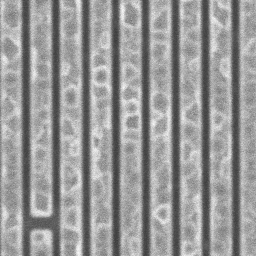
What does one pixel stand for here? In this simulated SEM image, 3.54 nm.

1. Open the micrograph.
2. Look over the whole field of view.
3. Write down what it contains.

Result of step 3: parallel lines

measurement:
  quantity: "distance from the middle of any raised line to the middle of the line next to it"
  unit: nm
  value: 106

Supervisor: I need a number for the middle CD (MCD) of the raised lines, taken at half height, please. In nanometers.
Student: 75.3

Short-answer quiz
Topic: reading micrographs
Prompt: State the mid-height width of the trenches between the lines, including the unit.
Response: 30.1 nm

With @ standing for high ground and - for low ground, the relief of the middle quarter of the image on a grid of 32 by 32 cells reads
@@@@---@@@@@--@@@@@---@@@@@--@@@
@@@@---@@@@@--@@@@@---@@@@@--@@@
@@@@---@@@@@--@@@@@---@@@@@--@@@
@@@@---@@@@@--@@@@@---@@@@@--@@@
@@@@---@@@@@--@@@@@---@@@@@--@@@
@@@@---@@@@@--@@@@@---@@@@@--@@@
@@@@---@@@@@--@@@@@---@@@@@--@@@
@@@@---@@@@@--@@@@@---@@@@@--@@@
@@@@---@@@@@--@@@@@---@@@@@--@@@
@@@@---@@@@@--@@@@@---@@@@@--@@@
@@@@---@@@@@--@@@@@---@@@@@--@@@
@@@@---@@@@@--@@@@@---@@@@@--@@@
@@@@---@@@@@--@@@@@---@@@@@--@@@
@@@@---@@@@@--@@@@@---@@@@@--@@@
@@@@---@@@@@--@@@@@---@@@@@--@@@
@@@@---@@@@@--@@@@@---@@@@@--@@@
@@@@---@@@@@--@@@@@---@@@@@--@@@
@@@@---@@@@@--@@@@@---@@@@@--@@@
@@@@---@@@@@--@@@@@---@@@@@--@@@
@@@@---@@@@@--@@@@@---@@@@@--@@@
@@@@---@@@@@--@@@@@---@@@@@--@@@
@@@@---@@@@@--@@@@@---@@@@@--@@@
@@@@---@@@@@--@@@@@---@@@@@--@@@
@@@@---@@@@@--@@@@@---@@@@@--@@@
@@@@---@@@@@--@@@@@---@@@@@--@@@
@@@@---@@@@@--@@@@@---@@@@@--@@@
@@@@---@@@@@--@@@@@---@@@@@--@@@
@@@@---@@@@@--@@@@@---@@@@@--@@@
@@@@---@@@@@--@@@@@---@@@@@--@@@
@@@@---@@@@@--@@@@@---@@@@@--@@@
@@@@---@@@@@--@@@@@---@@@@@--@@@
@@@@---@@@@@--@@@@@---@@@@@--@@@